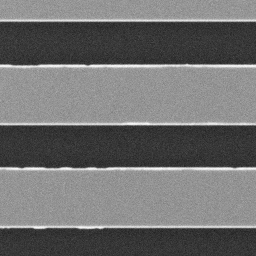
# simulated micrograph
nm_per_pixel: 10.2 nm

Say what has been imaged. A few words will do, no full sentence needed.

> lines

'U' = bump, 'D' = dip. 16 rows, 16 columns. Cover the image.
UUUUUUUUUUUUUUUU
DDDDDDDDDDDDDDDD
DDDDDDDDDDDDDDDD
DDDDDDDDDDDDDDDD
UUUUUUUUUUUUUUUU
UUUUUUUUUUUUUUUU
UUUUUUUUUUUUUUUU
UUUUUUUUUUUUUUUU
DDDDDDDDDDDDDDDD
DDDDDDDDDDDDDDDD
DDDDDDDDDDDDDDDD
UUUUUUUUUUUUUUUU
UUUUUUUUUUUUUUUU
UUUUUUUUUUUUUUUU
DDDDDDDDDDDDDDDD
DDDDDDDDDDDDDDDD